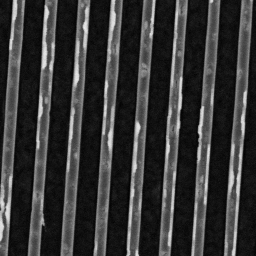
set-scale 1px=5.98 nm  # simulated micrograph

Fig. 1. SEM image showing parallel lines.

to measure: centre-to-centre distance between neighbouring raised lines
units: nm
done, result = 195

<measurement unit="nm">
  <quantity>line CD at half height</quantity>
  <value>70.1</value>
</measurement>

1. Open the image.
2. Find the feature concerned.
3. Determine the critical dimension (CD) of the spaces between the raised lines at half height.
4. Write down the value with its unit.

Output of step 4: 124 nanometres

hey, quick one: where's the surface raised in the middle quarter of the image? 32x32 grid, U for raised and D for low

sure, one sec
DDDUUDDDDDDUUUDDDDDUUDDDDDDUUUDD
DDDUUDDDDDDUUDDDDDDUUDDDDDDUUUDD
DDDUUDDDDDUUUDDDDDDUUDDDDDDUUUDD
DDDUUDDDDDUUUDDDDDDUUDDDDDDUUUDD
DDUUUDDDDDUUUDDDDDDUUDDDDDDUUDDD
DDUUUDDDDDUUUDDDDDDUUDDDDDDUUDDD
DDUUUDDDDDUUUDDDDDDUUDDDDDDUUDDD
DDUUUDDDDDUUUDDDDDUUUDDDDDDUUDDD
DDUUUDDDDDUUUDDDDDUUUDDDDDUUUDDD
DDUUUDDDDDUUUDDDDDUUUDDDDDUUUDDD
DDUUUDDDDDUUUDDDDDUUUDDDDDUUUDDD
DDUUDDDDDDUUUDDDDDUUUDDDDDUUUDDD
DDUUDDDDDDUUUDDDDDUUUDDDDDUUUDDD
DDUUDDDDDDUUDDDDDDUUUDDDDDUUUDDD
DDUUDDDDDDUUDDDDDDUUDDDDDDUUUDDD
DUUUDDDDDDUUDDDDDDUUDDDDDDUUUDDD
DUUUDDDDDDUUDDDDDDUUDDDDDDUUUDDD
DUUUDDDDDUUUDDDDDDUUDDDDDDUUUDDD
DUUUDDDDDUUUDDDDDDUUDDDDDDUUUDDD
DUUUDDDDDUUUDDDDDDUUDDDDDDUUDDDD
DUUUDDDDDUUUDDDDDDUUDDDDDDUUDDDD
DUUUDDDDDUUUDDDDDUUUDDDDDDUUDDDD
DUUUDDDDDUUUDDDDDUUUDDDDDDUUDDDD
DUUUDDDDDUUUDDDDDUUUDDDDDUUUDDDD
DUUUDDDDDUUUDDDDDUUUDDDDDUUUDDDD
DUUUDDDDDUUUDDDDDUUUDDDDDUUUDDDD
DUUDDDDDDUUUDDDDDUUUDDDDDUUUDDDD
DUUDDDDDDUUDDDDDDUUUDDDDDUUUDDDD
DUUDDDDDDUUDDDDDDUUUDDDDDUUUDDDD
DUUDDDDDDUUDDDDDDUUUDDDDDUUUDDDD
UUUDDDDDDUUDDDDDDUUUDDDDDUUUDDDD
UUUDDDDDUUUDDDDDDUUUDDDDDUUUDDDD